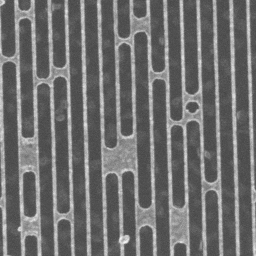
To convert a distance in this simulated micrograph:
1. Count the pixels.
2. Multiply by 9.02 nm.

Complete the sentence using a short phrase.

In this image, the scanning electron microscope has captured parallel lines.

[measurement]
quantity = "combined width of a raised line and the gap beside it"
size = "150 nm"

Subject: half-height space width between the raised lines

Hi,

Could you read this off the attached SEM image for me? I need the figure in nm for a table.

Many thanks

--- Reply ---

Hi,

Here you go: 125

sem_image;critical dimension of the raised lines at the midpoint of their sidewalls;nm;27.1